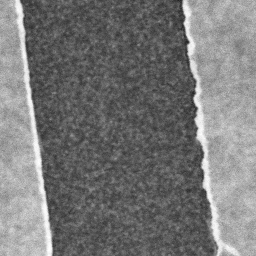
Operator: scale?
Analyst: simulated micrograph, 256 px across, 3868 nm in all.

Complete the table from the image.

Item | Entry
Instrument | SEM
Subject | one or a few lines or trenches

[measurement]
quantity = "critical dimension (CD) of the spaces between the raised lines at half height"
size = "165 px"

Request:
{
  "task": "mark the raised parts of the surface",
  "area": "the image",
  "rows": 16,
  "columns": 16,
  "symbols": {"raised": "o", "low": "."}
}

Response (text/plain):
o...........oooo
o...........oooo
o...........oooo
oo..........oooo
oo..........oooo
oo..........oooo
oo..........oooo
oo...........ooo
oo...........ooo
oo...........ooo
oo...........ooo
ooo..........ooo
ooo..........ooo
ooo..........ooo
ooo..........ooo
ooo...........oo